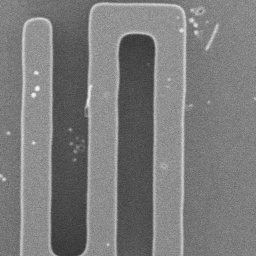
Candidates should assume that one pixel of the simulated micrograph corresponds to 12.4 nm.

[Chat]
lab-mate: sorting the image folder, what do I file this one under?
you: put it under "groups of lines, slits or small figures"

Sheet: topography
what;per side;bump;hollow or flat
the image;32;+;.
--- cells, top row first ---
............++..................
...........++++++++++++.........
....++.....++++++++++++.........
...+++.....++++++++++++.........
...+++.....+++++...++++.........
...+++.....++++....++++.........
...+++.....++++....++++.........
...+++.....++++....++++.........
...+++.....++++....++++.........
...+++.....++++....++++.........
...+++.....++++....++++.........
...+++.....++++....++++.........
...+++.....++++....++++.........
...+++.....++++....++++.........
...+++.....++++....++++.........
...+++.....++++....++++.........
...+++.....++++....++++.........
...+++.....++++....++++.........
...+++.....++++....++++.........
...+++.....++++....++++.........
...+++.....++++....++++.........
...+++.....++++....++++.........
...+++.....++++....++++.........
...+++.....++++....++++.........
...+++.....++++....++++.........
...+++.....++++....++++.........
...+++.....++++....++++.........
...+++.....++++....++++.........
...+++.....++++....++++.........
...+++.....+++.....++++.........
...+++.....+++.....++++.........
...++++...+++++....++++.........